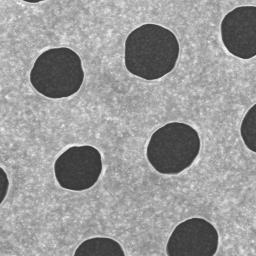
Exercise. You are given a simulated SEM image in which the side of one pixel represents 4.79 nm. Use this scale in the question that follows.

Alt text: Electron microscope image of holes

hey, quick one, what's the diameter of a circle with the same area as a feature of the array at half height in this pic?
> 249 nm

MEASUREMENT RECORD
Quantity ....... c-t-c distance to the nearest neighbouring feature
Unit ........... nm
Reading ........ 462